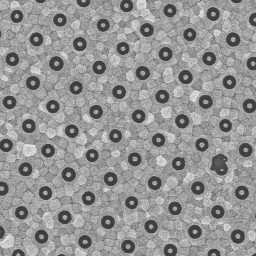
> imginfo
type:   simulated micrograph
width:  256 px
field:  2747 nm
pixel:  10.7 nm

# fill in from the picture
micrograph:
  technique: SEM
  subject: a regular array of ring-shaped grooves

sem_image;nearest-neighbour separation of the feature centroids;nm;324